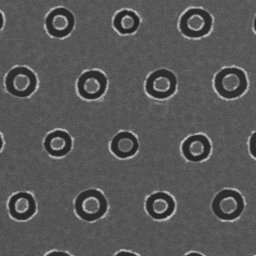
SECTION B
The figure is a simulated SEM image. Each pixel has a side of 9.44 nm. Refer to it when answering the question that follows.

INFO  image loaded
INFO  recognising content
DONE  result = a regular array of ring-shaped grooves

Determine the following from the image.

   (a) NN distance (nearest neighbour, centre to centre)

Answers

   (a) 642 nanometres